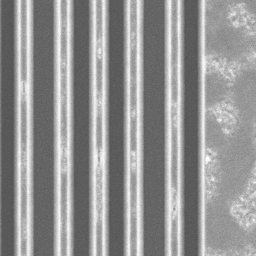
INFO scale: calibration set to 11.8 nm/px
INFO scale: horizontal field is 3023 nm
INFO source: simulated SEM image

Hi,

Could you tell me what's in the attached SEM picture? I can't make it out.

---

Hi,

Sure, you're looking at parallel lines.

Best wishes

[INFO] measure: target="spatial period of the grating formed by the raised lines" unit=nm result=445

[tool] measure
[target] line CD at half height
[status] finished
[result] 183 nm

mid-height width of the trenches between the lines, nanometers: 239